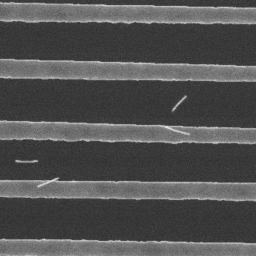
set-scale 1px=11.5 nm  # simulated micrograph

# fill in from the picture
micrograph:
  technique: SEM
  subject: lines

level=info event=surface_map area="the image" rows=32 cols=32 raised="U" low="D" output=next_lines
UUUUUUDDDDDDDDDDDDDDDDDDDDDDDDDD
UUUUUUUUUUUUUUUUUUUUUUUUUUUUUUUU
UUUUUUUUUUUUUUUUUUUUUUUUUUUUUUUU
DDDDDDDDDDDDDDDDDDDDDDDDDDDDDDDD
DDDDDDDDDDDDDDDDDDDDDDDDDDDDDDDD
DDDDDDDDDDDDDDDDDDDDDDDDDDDDDDDD
DDDDDDDDDDDDDDDDDDDDDDDDDDDDDDDD
UUDDDDDDDDDDDDDDDDDDDDDDDDDDDDDD
UUUUUUUUUUUUUUUUUUUUUUUUUUUUUUUU
UUUUUUUUUUUUUUUUUUUUUUUUUUUUUUUU
DDDDDDDDDDDDDDDDDDDDDDDDDDDDDDDD
DDDDDDDDDDDDDDDDDDDDDDDDDDDDDDDD
DDDDDDDDDDDDDDDDDDDDDDDDDDDDDDDD
DDDDDDDDDDDDDDDDDDDDDDDDDDDDDDDD
DDDDDDDDDDDDDDDDDDDDDDDDDDDDDDDD
UUUUUUUUUUUDDDDDDDDDDDDDDDDDDDDD
UUUUUUUUUUUUUUUUUUUUUUUUUUUUUUUU
DDDDDDUUUUUUUUUUUUUUUUUUUUUUUUUU
DDDDDDDDDDDDDDDDDDDDDDDDDDDDDDDD
DDDDDDDDDDDDDDDDDDDDDDDDDDDDDDDD
DDDDDDDDDDDDDDDDDDDDDDDDDDDDDDDD
DDDDDDDDDDDDDDDDDDDDDDDDDDDDDDDD
DDDDDDUDDDDDDDDDDDDDDDDDDDDDDDDD
UUUUUUUUUUUUUUUUUUUUUUUUUUUUUUUU
UUUUUUUUUUUUUUUUUUUUUUUUUUUUUUUU
DDDDDDDDDDDDDDDDDDDDDDDDDDDDDDDD
DDDDDDDDDDDDDDDDDDDDDDDDDDDDDDDD
DDDDDDDDDDDDDDDDDDDDDDDDDDDDDDDD
DDDDDDDDDDDDDDDDDDDDDDDDDDDDDDDD
DDDDDDDDDDDDDDDDDDDDDDDDDDDDDDDD
UUUUUUUUUUUUUUUUUUUUUUUUUUUUUUUU
UUUUUUUUUUUUUUUUUUUUUUUUUUUUUUUU